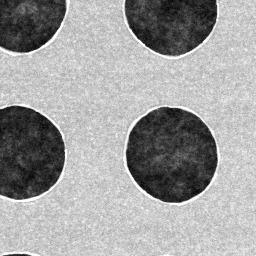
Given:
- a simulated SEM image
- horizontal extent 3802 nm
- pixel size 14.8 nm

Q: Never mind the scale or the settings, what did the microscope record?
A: holes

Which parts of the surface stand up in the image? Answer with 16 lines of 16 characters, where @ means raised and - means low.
----@@@@------@@
----@@@@-----@@@
---@@@@@@----@@@
@@@@@@@@@@-@@@@@
@@@@@@@@@@@@@@@@
@@@@@@@@@@@@@@@@
@@@@@@@@@@@@@@@@
---@@@@@@----@@@
----@@@@-----@@@
----@@@@------@@
----@@@@------@@
---@@@@@@----@@@
@@@@@@@@@@--@@@@
@@@@@@@@@@@@@@@@
@@@@@@@@@@@@@@@@
@@@@@@@@@@@@@@@@